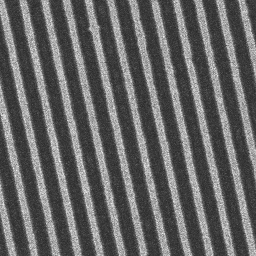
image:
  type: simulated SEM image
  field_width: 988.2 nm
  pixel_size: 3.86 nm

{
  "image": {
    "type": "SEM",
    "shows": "parallel lines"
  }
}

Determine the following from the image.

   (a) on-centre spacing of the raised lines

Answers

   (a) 82.5 nm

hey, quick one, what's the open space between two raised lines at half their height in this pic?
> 48.6 nm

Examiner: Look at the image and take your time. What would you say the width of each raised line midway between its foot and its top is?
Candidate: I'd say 0.0344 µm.